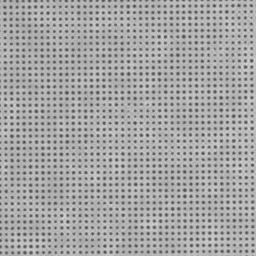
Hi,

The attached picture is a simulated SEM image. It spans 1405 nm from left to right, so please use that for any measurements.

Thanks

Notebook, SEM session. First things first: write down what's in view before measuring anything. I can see a regular array of holes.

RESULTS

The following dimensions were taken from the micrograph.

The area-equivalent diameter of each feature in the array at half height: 2.99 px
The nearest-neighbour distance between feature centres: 5.79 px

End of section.